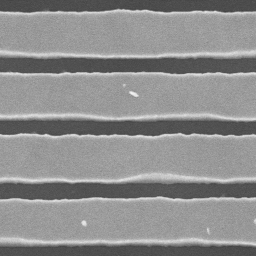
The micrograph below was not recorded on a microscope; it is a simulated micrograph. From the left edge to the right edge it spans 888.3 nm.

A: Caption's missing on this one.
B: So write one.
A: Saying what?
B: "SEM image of lines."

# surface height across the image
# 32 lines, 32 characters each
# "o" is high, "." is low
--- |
................................
.....o.o..o.oooooooo....ooo.....
oooooooooooooooooooooooooooooooo
oooooooooooooooooooooooooooooooo
oooooooooooooooooooooooooooooooo
oooooooooooooooooooooooooooooooo
oooooooooooooooooooooooooooooooo
................................
................................
oooooooooooooooooooooooooooooooo
oooooooooooooooooooooooooooooooo
oooooooooooooooooooooooooooooooo
oooooooooooooooooooooooooooooooo
oooooooooooooooooooooooooooooooo
oooooooooooooooooooooooooooooooo
................................
................................
oooooooooooooooooooooooooooooooo
oooooooooooooooooooooooooooooooo
oooooooooooooooooooooooooooooooo
oooooooooooooooooooooooooooooooo
oooooooooooooooooooooooooooooooo
oooooooooooooooooooooooooooooooo
................................
................................
oooooooooooooooooooooooooooooooo
oooooooooooooooooooooooooooooooo
oooooooooooooooooooooooooooooooo
oooooooooooooooooooooooooooooooo
oooooooooooooooooooooooooooooooo
oooooooooooooooooooooooooooooooo
................................